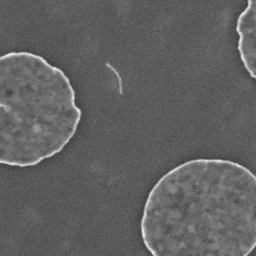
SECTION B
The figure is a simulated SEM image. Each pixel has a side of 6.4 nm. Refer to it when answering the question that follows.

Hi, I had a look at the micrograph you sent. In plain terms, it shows raised bodies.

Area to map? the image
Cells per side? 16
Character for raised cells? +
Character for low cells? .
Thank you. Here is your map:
...............+
...............+
...............+
++.............+
++++............
++++............
+++++...........
+++++...........
++++............
++++............
...........++++.
..........++++++
.........+++++++
.........+++++++
.........+++++++
.........+++++++